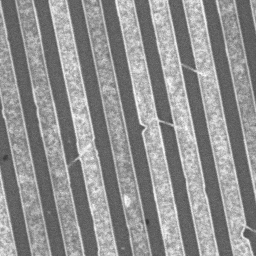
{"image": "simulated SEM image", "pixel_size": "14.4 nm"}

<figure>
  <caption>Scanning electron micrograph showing parallel lines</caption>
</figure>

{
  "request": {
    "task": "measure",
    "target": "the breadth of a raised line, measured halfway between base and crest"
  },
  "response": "256 nanometres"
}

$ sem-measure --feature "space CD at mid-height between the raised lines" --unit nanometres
214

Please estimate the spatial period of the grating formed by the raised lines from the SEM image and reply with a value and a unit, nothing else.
474 nm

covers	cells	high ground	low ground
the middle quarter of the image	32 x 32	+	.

++++....++++....+++++....++++...
++++....+++++...+++++....++++...
++++....+++++....++++....++++...
++++.....++++....++++....+++++..
+++++....++++....+++++...+++++..
.++++....++++....+++++....++++..
.++++....+++++...+++++....++++..
.++++....+++++....++++....++++..
.++++.....++++....++++....+++++.
.+++++....++++....+++++...+++++.
..++++....++++....+++++....++++.
..++++....+++++...+++++....++++.
..++++....+++++....++++....++++.
..++++.....++++....++++....+++++
..+++++....++++....+++++...+++++
...++++....++++.....++++...+++++
...++++....+++++....++++....++++
...++++....+++++....++++....++++
...++++.....++++....++++....++++
...++++.....++++....+++++...++++
...+++++....++++....+++++....+++
....++++....+++++...+++++....+++
....++++....+++++....++++....+++
....+++++....++++....++++....+++
....+++++....++++....+++++...+++
+....++++....++++....+++++....++
+....++++....+++++...+++++....++
+....++++....+++++....++++....++
+....++++.....++++....++++....++
+....+++++....++++....+++++....+
+.....++++....++++....+++++....+
++....++++....+++++...+++++....+